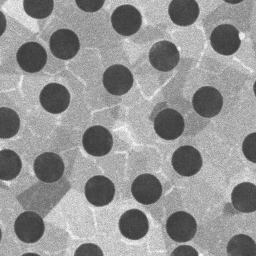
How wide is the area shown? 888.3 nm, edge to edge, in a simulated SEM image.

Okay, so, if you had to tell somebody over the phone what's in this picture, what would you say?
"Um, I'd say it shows a regular array of holes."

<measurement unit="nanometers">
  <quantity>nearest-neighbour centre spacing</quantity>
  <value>164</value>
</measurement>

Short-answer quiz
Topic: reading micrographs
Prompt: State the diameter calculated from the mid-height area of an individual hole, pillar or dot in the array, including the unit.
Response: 108 nm